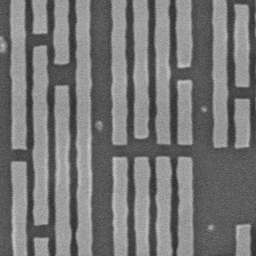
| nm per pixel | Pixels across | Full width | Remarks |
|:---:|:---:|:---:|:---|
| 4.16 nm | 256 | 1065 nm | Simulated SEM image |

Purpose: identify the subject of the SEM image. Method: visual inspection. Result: groups of lines, slits or small figures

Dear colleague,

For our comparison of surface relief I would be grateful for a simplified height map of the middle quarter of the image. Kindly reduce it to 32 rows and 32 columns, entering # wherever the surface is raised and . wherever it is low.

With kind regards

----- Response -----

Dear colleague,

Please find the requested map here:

...###......###...##...###...#..
...###......###...###..###......
...###......###...###..###......
...####.....###...###..###......
...####.....###...###..###...###
...####.....###...###..###..####
#..###......###...###..###...###
#..###......###...###..###...###
#..###......###...###..###...###
#..###......####..###..###..####
#..###......####..###..###..####
#..###......####..###..###...###
#..###......####..###..###...###
#..###......###...###..###...###
#..###......###...###..###...###
#..###......###...###..###...###
#..###......###...###..###..####
#..###......###...###..###..####
#..###......###........###...###
#..###......###........###...###
#..###..........................
#...##..........................
#...##..........................
#..###........#...###..###...##.
#..###.......###..###..###...###
#..###.......###..###..####.####
#...##.......###..###..####.####
#...###......##...###..####.####
#...###......###..###..####.####
#...###......###..###..####..###
#...###......###..###..####..###
#..####......###..###..####..###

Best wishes